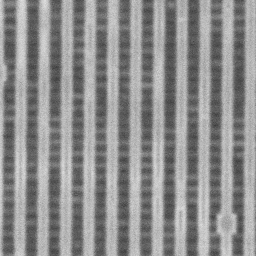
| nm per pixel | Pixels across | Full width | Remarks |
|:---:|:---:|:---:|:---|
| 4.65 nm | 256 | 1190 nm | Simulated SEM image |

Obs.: wiring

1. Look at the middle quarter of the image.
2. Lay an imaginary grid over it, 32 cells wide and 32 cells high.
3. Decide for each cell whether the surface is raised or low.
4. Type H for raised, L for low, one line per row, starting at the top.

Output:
HHLLLHHHLLLHHLLLLHHLLLLHHLLLHHHL
HHLLLHHHLLLHHLLLLHHLLLLHHLLLHHHL
HHLLLHHHLLLHHLLLLHHLLLLHHLLLHHLL
HHLLLHHHLLLHHLLLLHHLLLLHHLLLHHLL
HHLLLHHHLLLHHLLLLHHLLLHHHLLLHHLL
HHLLLHHHLLLHHLLLLHHLLLHHHLLLHHLL
HHLLLHHHLLLHHLLLLHHLLLLHHLLLHHLL
HHLLLHHHLLLHHLLLLHHLLLLHHLLLHHLL
HHLLLHHHLLLHHLLLLHHLLLHHHLLLHHHL
HHLLLHHHLLLHHLLLLHHLLLHHHLLLHHLL
HHLLLHHLLLLHHLLLLHHLLLHHHLLLHHLL
HHLLLHHLLLLHHLLLLHHLLLLHHLLLHHLL
HHLLLHHLLLLHHLLLLHHLLLLHHLLLHHLL
HHLLLHHLLLLHHLLLLHHLLLLHHLLLHHLL
HHLLLHHLLLLHHLLLLHHLLLHHHLLLHHLL
HHLLLHHLLLLHHLLLLHHLLLHHHLLLHHLL
HHLLLHHLLLLHHLLLLHHLLLHHHLLLHHLL
HHLLLHHLLLLHHLLLLHHLLLHHHLLLHHLL
HHLLLHHLLLLHHLLLLHHLLLHHHLLLHHLL
HHLLLHHLLLLHHLLLLHHLLLHHHLLLHHLL
HHLLLHHLLLLHHLLLLHHLLLHHHLLLHHLL
HHLLLHHLLLLHHLLLLHHLLLHHHLLLHHLL
HHLLLHHLLLLHHLLLLHHLLLHHHLLLHHLL
HHLLLHHLLLLHHLLLLHHLLLHHHLLLHHLL
HHLLLHHLLLLHHLLLLHHLLLHHHLLLHHLL
HHLLLHHLLLLHHLLLLHHLLLHHHLLLHHLL
HHLLLHHLLLLHHLLLLHHLLLHHHLLLHHLL
HHLLLHHLLLLHHLLLLHHLLLHHHLLLHHLL
HHLLLHHLLLLHHLLLLHHLLLHHHLLLHHLL
HHLLLHHLLLLHHLLLLHHLLLHHHLLLHHLL
HHLLLHHLLLLHHLLLLHHLLLHHHLLLHHLL
HHLLLHHLLLLHHLLLLHHLLLHHHLLLHHLL